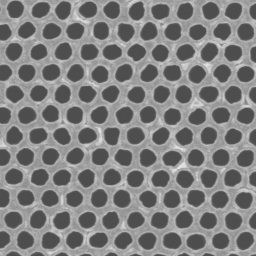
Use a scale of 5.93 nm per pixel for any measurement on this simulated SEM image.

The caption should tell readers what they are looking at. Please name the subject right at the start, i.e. a regular array of holes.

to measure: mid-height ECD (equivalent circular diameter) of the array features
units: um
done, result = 0.0986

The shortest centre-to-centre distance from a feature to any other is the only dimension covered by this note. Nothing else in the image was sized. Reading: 138 nanometers